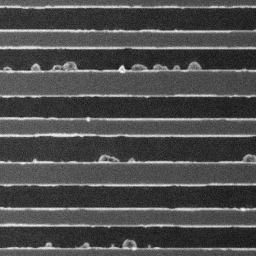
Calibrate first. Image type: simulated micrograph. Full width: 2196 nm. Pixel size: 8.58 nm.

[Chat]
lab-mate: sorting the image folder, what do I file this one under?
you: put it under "lines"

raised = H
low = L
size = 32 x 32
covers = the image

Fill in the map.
HHHHHHHHHHHHHHHHHHHHHHHHHHHHHHHH
LLLLLLLLLLLLLLLLLLLLLLLLLLLLLLLL
LLLLLLLLLLLLLLLLLLLLLLLLLLLLLLLL
LLLLLLLLLLLLLLLLLLLLLLLLLLLLLLLL
HHHHHHHHHHHHHHHHHHHHHHHHHHHHHHHH
HHHHHHHHHHHHHHHHHHHHHHHHHHHHHHHH
LLLLLLLLLLLLLLLLLLLLLLLLLLLLLLLL
LLLLLLLLLLLLLLLLLLLLLLLLLLLLLLLL
LLLLLLLLLLLLLLLLLLLLLLLLLLLLLLLL
HHHHHHHHHHHHHHHHHHHHHHHHHHHHHHHH
HHHHHHHHHHHHHHHHHHHHHHHHHHHHHHHH
HHHHHHHHHHHHHHHHHHHHHHHHHHHHHHHH
LLLLLLLLLLLLLLLLLLLLLLLLLLLLLLLL
LLLLLLLLLLLLLLLLLLLLLLLLLLLLLLLL
LLLLLLLLLLLLLLLLLLLLLLLLLLLLLLLL
HHHHHHHHHHHHHHHHHHHHHHHHHHHHHHHH
HHHHHHHHHHHHHHHHHHHHHHHHHHHHHHHH
LLLLLLLLLLLLLLLLLLLLLLLLLLLLLLLL
LLLLLLLLLLLLLLLLLLLLLLLLLLLLLLLL
LLLLLLLLLLLLLLLLLLLLLLLLLLLLLLLL
HHHHHHHHHHHHHHHHHHHHHHHHHHHHHHHH
HHHHHHHHHHHHHHHHHHHHHHHHHHHHHHHH
HHHHHHHHHHHHHHHHHHHHHHHHHHHHHHHH
LLLLLLLLLLLLLLLLLLLLLLLLLLLLLLLL
LLLLLLLLLLLLLLLLLLLLLLLLLLLLLLLL
LLLLLLLLLLLLLLLLLLLLLLLLLLLLLLLL
HHHHHHHHHHHHHHHHHHHHHHHHHHHHHHHH
HHHHHHHHHHHHHHHHHHHHHHHHHHHHHHHH
LLLLLLLLLLLLLLLLLLLLLLLLLLLLLLLL
LLLLLLLLLLLLLLLLLLLLLLLLLLLLLLLL
LLLLLLLLLLLLLLLLLLLLLLLLLLLLLLLL
HHHHHHHHHHHHHHHHHHHHHHHHHHHHHHHH